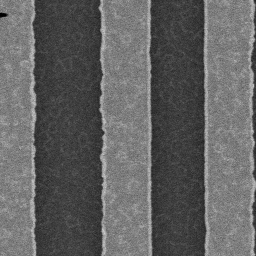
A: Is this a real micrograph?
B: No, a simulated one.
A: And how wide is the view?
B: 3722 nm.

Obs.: one or a few lines or trenches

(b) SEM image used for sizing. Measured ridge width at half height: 682 nanometers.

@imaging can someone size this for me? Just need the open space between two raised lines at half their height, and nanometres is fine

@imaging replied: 900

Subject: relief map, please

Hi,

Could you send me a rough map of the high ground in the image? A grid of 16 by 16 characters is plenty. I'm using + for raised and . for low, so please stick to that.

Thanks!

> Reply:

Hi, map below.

++....+++....+++
++....+++....+++
++....+++....+++
++....+++....+++
++....+++....+++
++....+++....+++
++....+++....+++
++....+++....+++
++.....++....+++
++....+++....+++
++....+++....+++
++.....++....+++
++....+++....+++
++....+++....+++
++....+++....+++
++....+++....+++